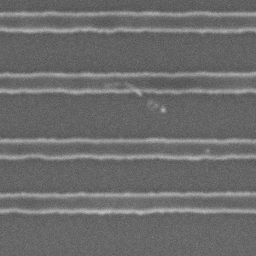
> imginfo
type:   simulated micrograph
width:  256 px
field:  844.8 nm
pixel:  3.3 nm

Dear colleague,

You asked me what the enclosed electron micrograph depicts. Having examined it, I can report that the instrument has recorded lines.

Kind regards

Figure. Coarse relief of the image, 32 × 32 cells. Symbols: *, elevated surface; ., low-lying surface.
................................
................................
********************************
********************************
................................
................................
................................
................................
................................
********************************
********************************
******.*************************
................................
................................
................................
................................
................................
....***.***....*..***........*..
********************************
********************************
................................
................................
................................
................................
********************************
********************************
...****************......*......
................................
................................
................................
................................
................................